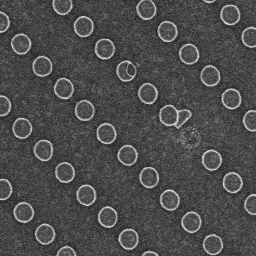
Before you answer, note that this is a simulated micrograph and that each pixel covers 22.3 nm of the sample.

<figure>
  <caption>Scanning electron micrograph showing a regular array of raised bodies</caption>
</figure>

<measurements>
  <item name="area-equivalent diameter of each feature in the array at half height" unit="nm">434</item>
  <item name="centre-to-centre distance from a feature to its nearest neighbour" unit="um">0.681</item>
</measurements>